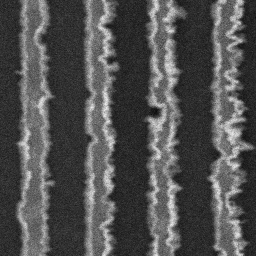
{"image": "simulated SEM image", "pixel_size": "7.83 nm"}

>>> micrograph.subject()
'one or a few lines or trenches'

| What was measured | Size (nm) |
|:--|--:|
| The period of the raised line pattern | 504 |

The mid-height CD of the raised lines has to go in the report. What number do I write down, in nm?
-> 185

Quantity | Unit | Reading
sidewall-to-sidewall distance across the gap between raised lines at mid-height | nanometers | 323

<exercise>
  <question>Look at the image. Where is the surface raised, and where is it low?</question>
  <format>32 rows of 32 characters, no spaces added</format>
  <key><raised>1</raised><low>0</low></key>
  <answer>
00011100000111000001110000011100
00011100000111000001110000011100
00011100000111000001110000011100
00011000000110000001110000011100
00011000000111000001100000011100
00011000000111000001110000011100
00011100000111000001100000011100
00011000000110000001110000011100
00011100000111100001110000011100
00011000000111000001110000011000
00011100000111000001110000011100
00011100000110000001110000011100
00011100000111000001110000011100
00011100000111000000110000011100
00011100000111000000110000011100
00011100000111000001110000011100
00011100000111000001110000011100
00011100000011000001110000011100
00011100000111000001110000011110
00011100000111000001110000001000
00011100000111000001110000011100
00011100000111000001100000011100
00011100000111000001100000111100
00011100000111000001110000011100
00011100000111000001110000011000
00011100000111000001110000011000
00111100000111000001110000011100
00111100000111000001110000011100
00011100000111000001110000011100
00011100000111000001110000011100
00011100000111000001110000011110
00011100000111000001110000011100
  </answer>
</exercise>